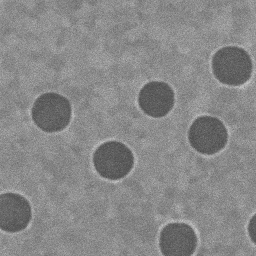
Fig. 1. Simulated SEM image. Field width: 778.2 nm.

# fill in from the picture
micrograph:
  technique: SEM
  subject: holes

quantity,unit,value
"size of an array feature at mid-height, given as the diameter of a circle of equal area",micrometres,0.127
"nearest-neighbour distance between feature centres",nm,223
